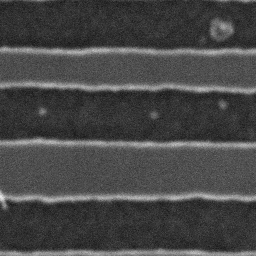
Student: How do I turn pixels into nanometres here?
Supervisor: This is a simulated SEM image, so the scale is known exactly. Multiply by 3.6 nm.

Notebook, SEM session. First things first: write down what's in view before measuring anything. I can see lines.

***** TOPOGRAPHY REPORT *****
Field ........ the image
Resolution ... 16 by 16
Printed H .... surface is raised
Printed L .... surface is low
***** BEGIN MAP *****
LLLLLLLLLLLLLLLL
LLLLLLLLLLLLLLLL
LLLLLLLLLLLLLLLL
HHHHHHHHHHHHHHHH
HHHHHHHHHHHHHHHH
LLLLLHHHHHLHHHHH
LLLLLLLLLLLLLLLL
LLLLLLLLLLLLLLLL
LLLLLLLLLLLLLLLL
HHHHHHHHHHHHHHHH
HHHHHHHHHHHHHHHH
HHHHHHHHHHHHHHHH
LHLHLLLLLLLLLLLH
LLLLLLLLLLLLLLLL
LLLLLLLLLLLLLLLL
LLLLLLLLLLLLLLLL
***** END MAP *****